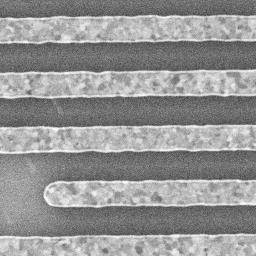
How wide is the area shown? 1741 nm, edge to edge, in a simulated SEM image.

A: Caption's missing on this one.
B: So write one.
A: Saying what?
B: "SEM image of groups of lines, slits or small figures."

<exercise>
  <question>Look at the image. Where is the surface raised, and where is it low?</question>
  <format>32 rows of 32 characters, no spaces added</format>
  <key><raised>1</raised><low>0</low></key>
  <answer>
00000000000000000000000000000000
00000000000000000000000000000000
11111111111111111111111111111111
11111111111111111111111111111111
11111111111111111111111111111111
00000000000000000000000000000000
00000000000000000000000000000000
00000000000000000000000000000000
00000000000000000000000000000000
11111111111111111111111111111111
11111111111111111111111111111111
11111111111111111111111111111111
00000000000000000000000000000000
00000000000000000000000000000000
00000000000000000000000000000000
00000000000000000000000000000000
11111111111111111111111111111111
11111111111111111111111111111111
11111111111111111111111111111111
00000000000000000000000000000000
00000000000000000000000000000000
00000000000000000000000000000000
00000000000000000000000000000000
00000011111111111111111111111111
00000011111111111111111111111111
00000011111111111111111111111111
00000000000000000000000000000000
00000000000000000000000000000000
00000000000000000000000000000000
00000000000000000000000011011111
11111111111111111111111111111111
11111111111111111111111111111111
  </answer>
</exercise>